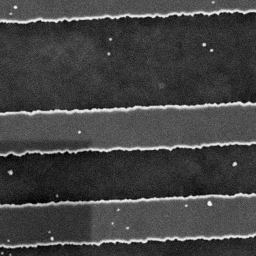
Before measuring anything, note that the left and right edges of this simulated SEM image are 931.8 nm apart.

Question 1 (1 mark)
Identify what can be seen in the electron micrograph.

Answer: lines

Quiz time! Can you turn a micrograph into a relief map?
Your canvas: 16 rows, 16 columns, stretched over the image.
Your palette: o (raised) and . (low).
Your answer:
oooooooooooooooo
................
................
................
................
................
.............ooo
oooooooooooooooo
oooooooooooooooo
oooo............
................
................
........oooooooo
oooooooooooooooo
oooooooooooooooo
................